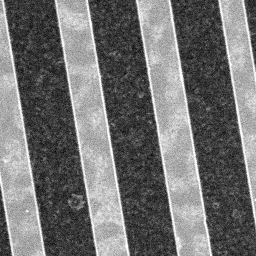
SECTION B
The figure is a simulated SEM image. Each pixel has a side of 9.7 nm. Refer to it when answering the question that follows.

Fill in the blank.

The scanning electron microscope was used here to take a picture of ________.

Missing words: one or a few lines or trenches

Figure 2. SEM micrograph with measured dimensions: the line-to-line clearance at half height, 0.292 microns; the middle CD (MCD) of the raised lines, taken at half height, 50.2 px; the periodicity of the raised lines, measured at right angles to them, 0.791 micrometres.